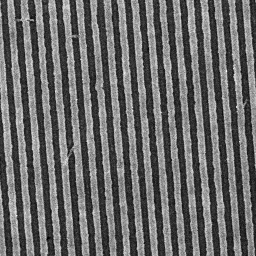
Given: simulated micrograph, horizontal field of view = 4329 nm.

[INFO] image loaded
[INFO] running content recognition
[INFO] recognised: parallel lines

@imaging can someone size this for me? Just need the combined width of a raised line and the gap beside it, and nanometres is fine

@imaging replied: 233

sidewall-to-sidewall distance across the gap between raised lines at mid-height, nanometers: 135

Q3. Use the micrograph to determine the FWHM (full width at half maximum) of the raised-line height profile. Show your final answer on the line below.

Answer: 0.0906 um